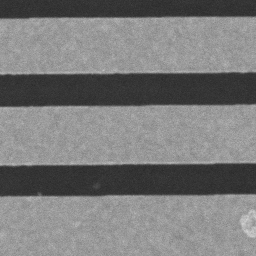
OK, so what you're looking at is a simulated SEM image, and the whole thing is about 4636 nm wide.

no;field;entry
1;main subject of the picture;lines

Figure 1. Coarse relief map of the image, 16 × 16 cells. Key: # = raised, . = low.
................
################
################
################
##############.#
................
................
################
################
################
................
................
################
################
################
################